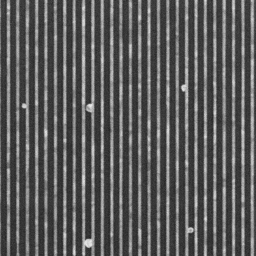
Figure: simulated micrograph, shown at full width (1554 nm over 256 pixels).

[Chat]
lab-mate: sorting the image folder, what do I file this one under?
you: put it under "parallel lines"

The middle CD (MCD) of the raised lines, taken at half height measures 14.4 nanometers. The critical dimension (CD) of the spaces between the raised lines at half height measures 7.13 pixels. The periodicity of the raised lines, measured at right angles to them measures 56.9 nm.